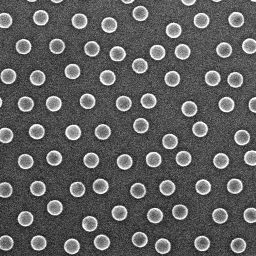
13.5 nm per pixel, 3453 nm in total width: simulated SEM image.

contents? a regular array of raised bodies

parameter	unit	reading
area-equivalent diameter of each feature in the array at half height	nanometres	201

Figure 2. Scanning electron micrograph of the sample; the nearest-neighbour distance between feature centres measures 0.374 µm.